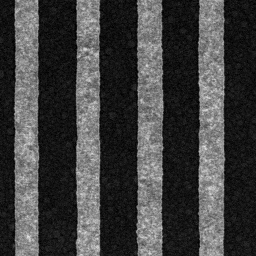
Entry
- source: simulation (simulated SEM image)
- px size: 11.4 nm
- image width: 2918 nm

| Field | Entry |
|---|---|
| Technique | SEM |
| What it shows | one or a few lines or trenches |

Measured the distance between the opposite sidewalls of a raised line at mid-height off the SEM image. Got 262 nm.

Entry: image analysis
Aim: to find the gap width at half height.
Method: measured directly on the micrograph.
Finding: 433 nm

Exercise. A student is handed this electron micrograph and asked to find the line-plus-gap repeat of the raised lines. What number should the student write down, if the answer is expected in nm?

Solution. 703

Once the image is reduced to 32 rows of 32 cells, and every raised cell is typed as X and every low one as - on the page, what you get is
--XXX-----XX-----XXX-----XXX----
--XXX-----XX-----XXX-----XXX----
--XXX-----XX-----XXX-----XXX----
--XXX-----XX-----XXX-----XXX----
--XXX-----XX-----XXX-----XXX----
--XXX-----XX-----XXX-----XXX----
--XXX-----XX-----XXX-----XXX----
--XXX-----XX-----XXX-----XXX----
--XXX-----XX-----XXX-----XXX----
--XXX-----XX-----XXX-----XXX----
--XXX-----XX-----XXX-----XXX----
--XXX-----XX-----XXX-----XXX----
--XXX-----XX-----XXX-----XXX----
--XXX-----XX-----XXX-----XXX----
--XXX-----XX-----XXX-----XXX----
--XXX-----XX-----XXX-----XXX----
--XXX-----XX-----XXX-----XXX----
--XXX-----XX-----XXX-----XXX----
--XXX-----XX-----XXX-----XXX----
--XXX-----XX-----XXX-----XXX----
--XXX-----XX-----XXX-----XXX----
--XXX-----XX-----XXX-----XXX----
--XXX-----XX-----XXX-----XXX----
--XXX-----XX-----XXX-----XXX----
--XXX-----XX-----XXX-----XXX----
--XXX-----XX-----XXX-----XXX----
--XXX-----XX-----XXX-----XXX----
--XXX-----XX-----XXX-----XXX----
--XXX-----XX-----XXX-----XXX----
--XXX-----XX-----XXX-----XXX----
--XXX-----XX-----XXX-----XXX----
--XXX-----XX-----XXX-----XXX----